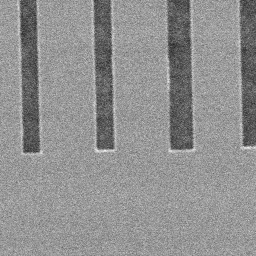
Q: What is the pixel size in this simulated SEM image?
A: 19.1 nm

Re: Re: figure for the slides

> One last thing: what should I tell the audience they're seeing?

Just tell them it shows one or a few lines or trenches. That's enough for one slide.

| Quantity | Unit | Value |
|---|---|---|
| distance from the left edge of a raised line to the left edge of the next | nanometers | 1430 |